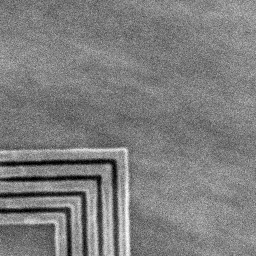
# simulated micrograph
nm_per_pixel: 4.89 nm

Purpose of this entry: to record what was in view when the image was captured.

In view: groups of lines, slits or small figures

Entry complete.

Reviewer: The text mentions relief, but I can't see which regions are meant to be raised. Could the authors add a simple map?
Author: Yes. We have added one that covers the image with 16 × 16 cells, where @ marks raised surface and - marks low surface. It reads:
----------------
----------------
----------------
----------------
----------------
----------------
----------------
----------------
----------------
@@@@@@-@--------
@@@@@@@@--------
@@-@@@@@--------
@@@@@@@@--------
@@@@@-----------
----@@----------
----@@@---------